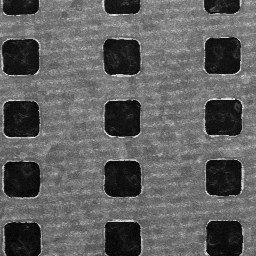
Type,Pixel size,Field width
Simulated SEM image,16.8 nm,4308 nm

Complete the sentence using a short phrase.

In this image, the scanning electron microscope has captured a regular array of holes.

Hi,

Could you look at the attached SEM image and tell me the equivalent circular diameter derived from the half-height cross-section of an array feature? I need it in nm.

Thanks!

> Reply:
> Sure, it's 682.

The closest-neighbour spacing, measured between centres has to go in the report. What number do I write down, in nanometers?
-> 1020